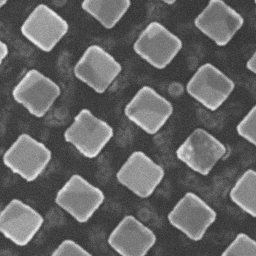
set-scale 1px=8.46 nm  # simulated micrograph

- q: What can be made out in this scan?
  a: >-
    a regular array of raised bodies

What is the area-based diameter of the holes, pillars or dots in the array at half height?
345 nm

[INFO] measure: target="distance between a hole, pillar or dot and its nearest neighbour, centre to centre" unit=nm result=550